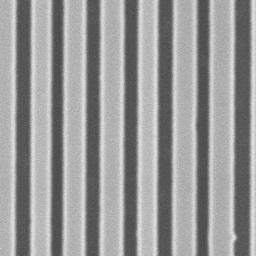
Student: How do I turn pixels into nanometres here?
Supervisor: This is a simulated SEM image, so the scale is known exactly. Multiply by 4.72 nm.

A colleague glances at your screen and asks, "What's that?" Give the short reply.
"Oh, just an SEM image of parallel lines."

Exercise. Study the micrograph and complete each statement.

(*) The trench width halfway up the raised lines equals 0.0773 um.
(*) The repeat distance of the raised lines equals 36.1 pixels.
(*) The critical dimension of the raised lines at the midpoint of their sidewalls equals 99.8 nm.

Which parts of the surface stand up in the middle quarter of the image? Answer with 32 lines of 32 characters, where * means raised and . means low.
*****.....*****....****.....****
*****.....*****....****.....****
*****....******....****.....****
*****....******....****.....****
*****.....*****....****.....****
*****.....*****....****.....****
*****.....*****....****.....****
*****....******....****.....****
*****....******....****.....****
*****....******....****.....****
*****.....*****....****.....****
*****.....*****....****.....****
*****.....*****....****.....****
*****....******....****.....****
*****....******....****.....****
*****....******....****.....****
*****....******....****.....****
*****....******....****.....****
*****....******....****.....****
*****....******....****.....****
*****....******....****.....****
*****....******....****.....****
*****....******....****.....****
*****....******....****.....****
*****....******....****.....****
*****....*****.....****....*****
*****....*****.....****....*****
*****....*****.....****....*****
*****....*****.....****....*****
*****....*****.....****....*****
*****....*****.....****....*****
*****....*****.....****....*****